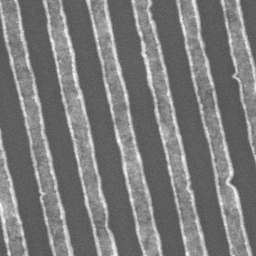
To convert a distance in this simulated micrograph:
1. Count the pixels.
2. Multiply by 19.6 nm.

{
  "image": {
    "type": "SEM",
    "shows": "parallel lines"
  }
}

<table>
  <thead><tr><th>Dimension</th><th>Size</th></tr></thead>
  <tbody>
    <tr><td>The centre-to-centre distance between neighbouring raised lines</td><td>852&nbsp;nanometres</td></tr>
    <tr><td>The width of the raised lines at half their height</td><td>0.328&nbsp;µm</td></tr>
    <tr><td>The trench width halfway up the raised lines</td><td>524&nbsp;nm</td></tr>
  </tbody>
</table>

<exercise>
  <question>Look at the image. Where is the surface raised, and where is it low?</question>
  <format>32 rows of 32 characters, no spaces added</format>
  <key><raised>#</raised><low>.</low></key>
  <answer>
##....##...##....##...##....##..
##....##...##....##...###...##..
###...##....##...##....##...##..
###...##....##...##....##...##..
.##...###...##....##...##....##.
.##....##...##....##...##....##.
.##....##...##....##...###...##.
.###...##....##...##....##...##.
..##...##....##...###...##...###
..##...###...##....##...##...###
..##....##...##....##...###...##
..###...##...###...##....##...##
...##...##....##...##....##...##
...##...###...##...###...##....#
...##...###...##....##...##....#
...##....##...##....##...###...#
....#....##...###...##....##...#
....##...##....##...###...##...#
....##...###...##....##...##...#
#...##....##...##....##....##...
#...##....##...###...##....##...
#....##...##....##...##....##...
#....##...##....##...###...##...
#....##...###...##....##...##...
##...##....##...###...##...###..
##...###...##...###...##....##..
##....##...##....##...##....##..
##....##...##....##....##...##..
###...##....#....##....##...##..
.##...##....##...###...##...###.
.##...###...##....##...##....##.
.##....##...###...##...###...##.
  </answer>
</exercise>